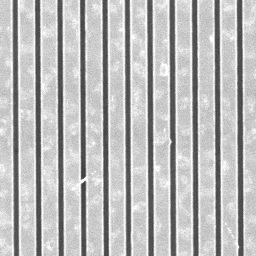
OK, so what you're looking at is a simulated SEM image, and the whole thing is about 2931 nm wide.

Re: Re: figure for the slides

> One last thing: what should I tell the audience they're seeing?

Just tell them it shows parallel lines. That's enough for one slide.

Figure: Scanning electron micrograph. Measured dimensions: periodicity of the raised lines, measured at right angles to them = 0.257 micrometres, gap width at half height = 5.37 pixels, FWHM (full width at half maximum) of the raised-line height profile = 0.192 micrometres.